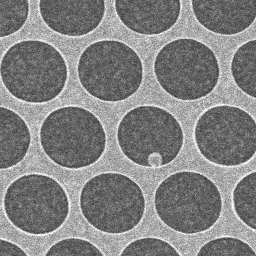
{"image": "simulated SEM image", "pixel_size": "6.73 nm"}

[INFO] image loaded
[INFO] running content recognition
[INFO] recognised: holes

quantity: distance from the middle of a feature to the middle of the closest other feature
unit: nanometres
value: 512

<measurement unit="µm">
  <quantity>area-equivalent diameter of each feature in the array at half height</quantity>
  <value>0.427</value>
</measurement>